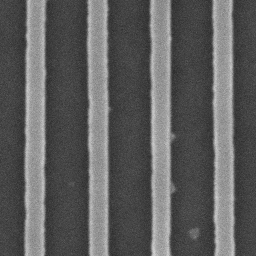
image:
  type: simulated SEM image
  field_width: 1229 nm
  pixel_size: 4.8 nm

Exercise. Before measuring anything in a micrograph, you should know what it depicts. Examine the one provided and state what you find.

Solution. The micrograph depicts lines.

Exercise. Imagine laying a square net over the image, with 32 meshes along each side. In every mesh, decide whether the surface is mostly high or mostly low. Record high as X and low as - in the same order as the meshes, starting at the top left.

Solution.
---XXX-----XX------XX------XX---
---XXX-----XX------XX------XX---
---XXX-----XX------XX------XX---
---XXX-----XX------XX------XX---
---XXX-----XX------XX------XX---
---XXX-----XX------XX------XX---
---XXX-----XX------XX------XX---
---XXX-----XX------XX------XX---
---XXX-----XX------XX------XX---
---XXX-----XX------XX------XX---
---XXX-----XX------XX------XX---
---XXX-----XX------XX------XX---
---XXX-----XX------XX------XX---
---XXX-----XX------XX------XX---
---XXX-----XX------XX------XX---
---XXX-----XX------XX------XX---
---XXX-----XX------XX------XX---
---XXX-----XX------XX------XX---
---XXX-----XX------XX------XX---
---XXX-----XX------XX------XX---
---XX------XX------XX------XX---
---XX------XX------XX------XX---
---XXX-----XX------XX------XX---
---XXX-----XX------XX------XX---
---XXX-----XX------XX------XX---
---XX------XX------XX------XX---
---XXX-----XX------XX------XX---
---XXX-----XX------XX------XX---
---XX------XX------XX------XX---
---XX------XX------XX------XX---
---XX------XX------XX------XX---
---XX------XX------XX------XX---